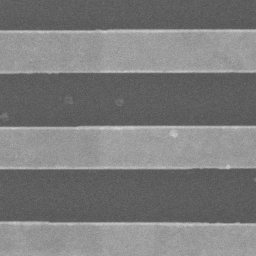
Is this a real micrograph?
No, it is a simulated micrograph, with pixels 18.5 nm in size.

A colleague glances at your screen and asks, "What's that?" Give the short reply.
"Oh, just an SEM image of lines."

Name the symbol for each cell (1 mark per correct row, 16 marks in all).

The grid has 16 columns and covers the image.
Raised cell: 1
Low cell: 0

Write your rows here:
0000000000000000
0000000000000000
1111111111111111
1111111111111111
1111111111111111
0000000000000000
0000000000000000
0000000000000000
1111111111111111
1111111111111111
1111111111100110
0000000000000000
0000000000000000
0000000000000000
1111111111111111
1111111111111111